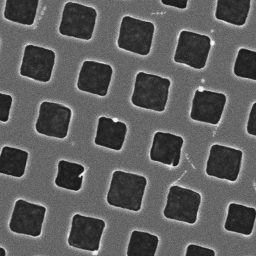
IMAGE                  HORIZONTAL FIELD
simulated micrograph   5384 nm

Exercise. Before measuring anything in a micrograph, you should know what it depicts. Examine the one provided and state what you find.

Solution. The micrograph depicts a regular array of holes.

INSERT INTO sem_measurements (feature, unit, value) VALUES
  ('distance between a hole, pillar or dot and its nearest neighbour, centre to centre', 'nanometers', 1220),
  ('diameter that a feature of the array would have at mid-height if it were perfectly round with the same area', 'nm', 759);